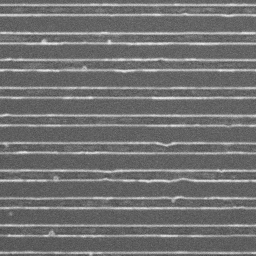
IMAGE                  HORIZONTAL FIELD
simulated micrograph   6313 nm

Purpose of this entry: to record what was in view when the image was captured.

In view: parallel lines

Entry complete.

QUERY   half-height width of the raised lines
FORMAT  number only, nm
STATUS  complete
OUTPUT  453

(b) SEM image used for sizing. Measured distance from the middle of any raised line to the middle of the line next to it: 27.6 pixels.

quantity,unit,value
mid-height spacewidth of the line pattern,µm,0.225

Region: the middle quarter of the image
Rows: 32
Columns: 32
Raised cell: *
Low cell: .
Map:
................................
...............................*
********************************
********************************
********************************
********************************
................................
................................
......*.........................
********************************
********************************
********************************
********************************
................................
................................
********************************
********************************
********************************
********************************
********************************
................................
................................
********************************
********************************
********************************
********************************
********************************
................................
................................
********************************
********************************
********************************